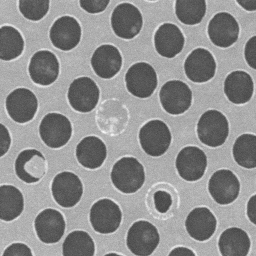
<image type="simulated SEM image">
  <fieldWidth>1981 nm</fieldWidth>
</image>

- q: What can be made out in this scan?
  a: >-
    a regular array of holes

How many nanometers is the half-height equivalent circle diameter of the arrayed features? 264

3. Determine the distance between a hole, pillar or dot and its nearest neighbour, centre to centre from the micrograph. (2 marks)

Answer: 316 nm